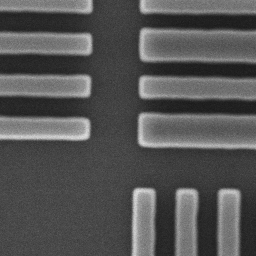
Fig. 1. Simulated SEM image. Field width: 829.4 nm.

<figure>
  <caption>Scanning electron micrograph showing groups of lines, slits or small figures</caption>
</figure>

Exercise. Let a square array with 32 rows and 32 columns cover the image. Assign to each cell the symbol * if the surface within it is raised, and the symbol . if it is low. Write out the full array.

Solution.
***********.......**************
....................************
................................
................................
***********.......**************
***********.......**************
***********.......**************
..................**************
................................
********........................
***********.......**************
***********.......**************
................................
................................
..................***********...
***********......***************
***********......***************
..................**************
................................
................................
................................
................................
................................
................................
.................**...***...**..
.................**...***..***..
.................**...***..***..
.................**...**...***..
.................**...**...***..
.................**...**...***..
.................**...**...***..
.................**...**...***..